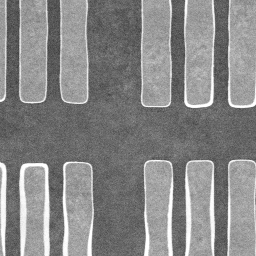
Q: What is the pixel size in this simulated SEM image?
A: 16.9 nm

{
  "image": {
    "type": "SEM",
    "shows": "groups of lines, slits or small figures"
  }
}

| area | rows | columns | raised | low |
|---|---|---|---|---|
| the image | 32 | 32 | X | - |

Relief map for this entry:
X--XXX--XXX-------XXX--XXXX--XXX
X--XXX--XXX-------XXX--XXXX--XXX
X--XXX--XXX-------XXX--XXXX--XXX
X--XXX--XXX-------XXX--XXXX--XXX
X--XXX--XXX-------XXX--XXXX--XXX
X--XXX--XXX-------XXX--XXXX--XXX
X--XXX--XXX-------XXX--XXXX--XXX
X--XXX--XXX-------XXX--XXXX--XXX
X--XXX--XXX-------XXX--XXXX--XXX
X--XXX--XXX-------XXX--XXX---XXX
X--XXX--XXX-------XXX--XXX---XXX
X--XXX--XXX-------XXX--XXX---XXX
---XX---XXX-------XXX--XXX---XXX
--------------------------------
--------------------------------
--------------------------------
--------------------------------
--------------------------------
--------------------------------
--------------------------------
--------XXX-------XXX---XXX--XXX
---XXX--XXXX------XXXX-XXXX--XXX
---XXX--XXXX------XXXX-XXXX--XXX
---XXX--XXXX------XXX--XXX---XXX
---XXX--XXXX------XXX---XX---XXX
---XXX--XXXX------XXX---XX---XXX
---XXX--XXXX------XXX---XX---XXX
---XXX--XXXX------XXX---XX---XXX
---XXX--XXX-------XXX---XXX--XXX
---XXX--XXX-------XXX---XXX--XXX
---XXX--XXX-------XXX---XXX--XXX
---XXX--XXX-------XXX--XXXX--XXX